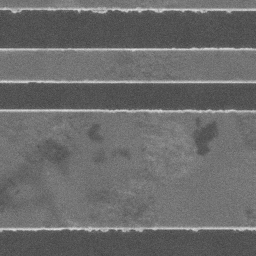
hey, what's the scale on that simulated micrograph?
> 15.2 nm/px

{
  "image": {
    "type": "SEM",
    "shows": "lines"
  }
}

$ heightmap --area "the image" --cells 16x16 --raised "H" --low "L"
HHHHHHHHHHHHHHHH
LLLLLLLLLLLLLLLL
LLLLLLLLLLLLLLLL
HHHHHHHHHHHHHHHH
HHHHHHHHHHHHHHHH
LLLLLLLLLLLLLLLL
LLLLLLLLLLLLLLLL
HHHHHHHHHHHHHHHH
HHHHHHHHHHHHHHHH
HHHHHHHHHHHHHHHH
HHHHHHHHHHHHHHHH
HHHHHHHHHHHHHHHH
HHHHHHHHHHHHHHHH
HHHHHHHHHHHHHHHH
LLLLLLLLLLLLLLLL
LLLLLLLLLLLLLLLL